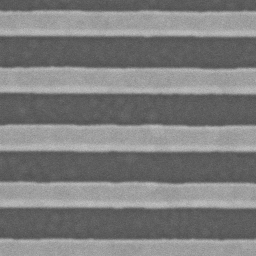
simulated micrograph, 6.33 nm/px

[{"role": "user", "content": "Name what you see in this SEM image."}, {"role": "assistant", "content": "lines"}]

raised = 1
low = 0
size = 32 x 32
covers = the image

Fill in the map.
00000000000000000000000000000000
00000110110000000000000000000000
11111111111111111111111111111111
11111111111111111111111111111111
00000000000000000000000000000000
00000000000000000000000000000000
00000000000000000000000000000000
00000000000000000000000000000000
00001111110000000000000000000000
11111111111111111111111111111111
11111111111111111111111111111111
00000000000000000111110000000000
00000000000000000000000000000000
00000000000000000000000000000000
00000000000000000000000000000000
00000000000000000000000000000000
11111111111111111111111111111111
11111111111111111111111111111111
11111111111111111111111111111111
00000000000000000000000000000000
00000000000000000000000000000000
00000000000000000000000000000000
00000000000000000000000000000000
11111111111111111111111111111111
11111111111111111111111111111111
11111111111111111111111111111111
00000000000000000000000000000000
00000000000000000000000000000000
00000000000000000000000000000000
00000000000000000000000000000000
11111111111111111111111111111111
11111111111111111111111111111111